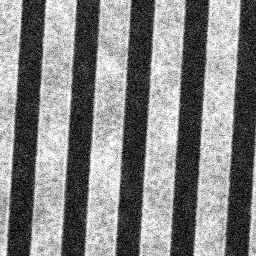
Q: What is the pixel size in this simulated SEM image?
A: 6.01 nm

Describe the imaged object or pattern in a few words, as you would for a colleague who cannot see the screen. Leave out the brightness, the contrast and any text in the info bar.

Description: parallel lines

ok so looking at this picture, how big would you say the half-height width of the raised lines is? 170 nanometers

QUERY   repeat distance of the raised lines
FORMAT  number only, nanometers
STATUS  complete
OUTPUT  327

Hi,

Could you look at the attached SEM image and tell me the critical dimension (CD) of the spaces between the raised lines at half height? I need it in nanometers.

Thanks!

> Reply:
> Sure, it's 154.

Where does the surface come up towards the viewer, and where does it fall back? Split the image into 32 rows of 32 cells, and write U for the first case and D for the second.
UUUDDDUUUDDDDUUUDDDDUUUDDDUUUUDD
UUUDDDUUUDDDDUUUDDDUUUUDDDUUUUDD
UUDDDDUUUDDDDUUUDDDUUUUDDDUUUUDD
UUDDDDUUUDDDDUUUDDDUUUUDDDUUUUDD
UUDDDDUUUDDDUUUUDDDUUUUDDDUUUUDD
UUDDDDUUUDDDUUUUDDDUUUUDDDUUUUDD
UUDDDDUUUDDDUUUUDDDUUUUDDDUUUUDD
UUDDDUUUUDDDUUUUDDDUUUUDDDUUUDDD
UUDDDUUUUDDDUUUUDDDUUUUDDDUUUDDD
UUDDDUUUUDDDUUUUDDDUUUDDDDUUUDDD
UUDDDUUUUDDDUUUUDDDUUUDDDDUUUDDD
UUDDDUUUUDDDUUUUDDDUUUDDDDUUUDDD
UUDDDUUUUDDDUUUDDDDUUUDDDDUUUDDD
UUDDDUUUUDDDUUUDDDDUUUDDDDUUUDDD
UUDDDUUUUDDDUUUDDDDUUUDDDUUUUDDD
UUDDDUUUDDDDUUUDDDDUUUDDDUUUUDDD
UUDDDUUUDDDDUUUDDDDUUUDDDUUUUDDD
UUDDDUUUDDDDUUUDDDUUUUDDDUUUUDDD
UDDDDUUUDDDDUUUDDDUUUUDDDUUUUDDD
UDDDDUUUDDDDUUUDDDUUUUDDDUUUUDDD
UDDDDUUUDDDUUUUDDDUUUUDDDUUUUDDD
UDDDDUUUDDDUUUUDDDUUUUDDDUUUUDDD
UDDDDUUUDDDUUUUDDDUUUUDDDUUUUDDD
UDDDUUUUDDDUUUUDDDUUUUDDDUUUDDDD
UDDDUUUUDDDUUUUDDDUUUUDDDUUUDDDD
UDDDUUUUDDDUUUUDDDUUUDDDDUUUDDDD
UDDDUUUUDDDUUUUDDDUUUDDDDUUUDDDD
UDDDUUUUDDDUUUUDDDUUUDDDDUUUDDDU
UDDDUUUUDDDUUUDDDDUUUDDDDUUUDDDU
UDDDUUUUDDDUUUDDDDUUUDDDDUUUDDDU
UDDDUUUUDDDUUUDDDDUUUDDDUUUUDDDU
UDDDUUUDDDDUUUDDDDUUUDDDUUUUDDDU